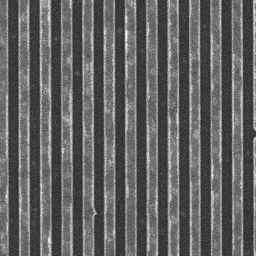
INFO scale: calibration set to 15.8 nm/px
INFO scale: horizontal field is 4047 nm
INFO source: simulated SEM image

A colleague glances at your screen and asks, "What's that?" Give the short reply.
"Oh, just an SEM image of parallel lines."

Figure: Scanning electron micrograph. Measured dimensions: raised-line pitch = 0.337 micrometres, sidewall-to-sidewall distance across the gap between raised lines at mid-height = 176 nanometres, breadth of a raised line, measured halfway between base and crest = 160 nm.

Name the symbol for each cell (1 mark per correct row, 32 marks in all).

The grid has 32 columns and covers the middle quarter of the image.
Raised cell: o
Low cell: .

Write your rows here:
oo...oo...oo....oo...oo...oo...o
oo...oo...oo....oo...oo...oo...o
oo...oo...oo....oo...oo...oo...o
oo...oo...oo....oo...oo...oo...o
oo...oo...oo....oo...oo...oo...o
oo...oo...ooo...oo...oo...oo...o
oo...oo...ooo...oo...oo...oo...o
oo...oo...ooo...oo...oo...oo...o
oo...oo...ooo...oo...oo...oo...o
oo...oo...ooo...oo...oo...oo...o
oo...oo...ooo...oo...oo...oo...o
oo...oo...ooo...oo...oo...oo...o
oo...oo...ooo...oo...oo...oo...o
oo...oo...ooo...oo...oo...oo...o
oo...oo...ooo...oo...oo...oo...o
oo...oo...ooo...oo...oo...oo...o
oo...oo...ooo...oo...oo...oo...o
oo...oo...ooo...oo...oo...oo...o
oo...oo...ooo...oo...oo...oo...o
oo...oo...ooo...oo...oo...oo...o
oo...oo...ooo...oo...oo...oo...o
oo...oo...ooo...oo...oo...oo....
oo...oo...ooo...oo...oo...oo....
oo...oo...ooo...oo...oo...oo....
oo...oo...ooo...oo...oo...oo....
oo...oo...ooo...oo...oo...oo....
oo...oo...ooo...oo...oo...oo....
oo...oo...ooo...oo...oo...oo....
oo...oo...ooo...oo...oo...oo....
oo...oo...ooo...oo...oo...oo....
oo...oo...ooo...oo...oo...ooo...
oo...oo...ooo...oo...oo...ooo...